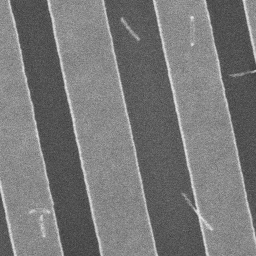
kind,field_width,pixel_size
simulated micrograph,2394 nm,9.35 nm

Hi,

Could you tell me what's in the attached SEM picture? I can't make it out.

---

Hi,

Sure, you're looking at lines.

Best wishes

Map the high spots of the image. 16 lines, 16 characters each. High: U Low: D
UDDUUUUDDDUUUDDU
UDDUUUUDDDUUUDDU
UDDUUUUDDDUUUDDD
UDDDUUUDDDUUUUDD
UUDDUUUDDDUUUUDD
UUDDUUUUDDDUUUDD
UUDDUUUUDDDUUUDD
UUDDDUUUDDDUUUDD
UUDDDUUUDDDUUUUD
UUUDDUUUDDDDUUUD
UUUDDUUUUDDDUUUD
UUUDDUUUUDDDUUUD
UUUDDDUUUDDDUUUD
UUUDDDUUUDDDUUUU
DUUUDDUUUUDDDUUU
DUUUDDUUUUDDDUUU